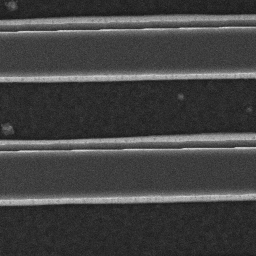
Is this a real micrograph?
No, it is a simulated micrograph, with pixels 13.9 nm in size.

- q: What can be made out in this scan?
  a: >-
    lines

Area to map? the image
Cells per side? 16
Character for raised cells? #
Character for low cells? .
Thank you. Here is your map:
................
################
################
################
################
................
................
................
................
################
################
################
#####...........
................
................
................